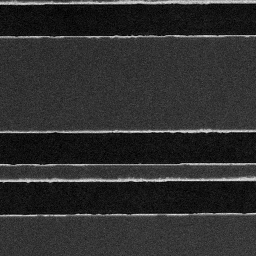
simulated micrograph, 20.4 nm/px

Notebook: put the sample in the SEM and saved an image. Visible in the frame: lines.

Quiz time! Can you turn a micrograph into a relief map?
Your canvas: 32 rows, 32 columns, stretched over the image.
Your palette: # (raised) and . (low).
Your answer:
..##............................
................................
................................
................................
...................####.########
################################
################################
################################
################################
################################
################################
################################
################################
################################
################################
################################
#############...................
................................
................................
................................
.................#....##########
################################
################################
................................
................................
................................
................................
################################
################################
################################
################################
################################